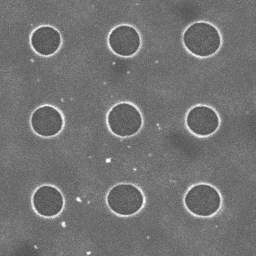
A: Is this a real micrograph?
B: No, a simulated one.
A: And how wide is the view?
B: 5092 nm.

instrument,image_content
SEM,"a regular array of holes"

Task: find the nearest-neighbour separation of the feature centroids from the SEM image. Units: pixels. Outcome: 77.6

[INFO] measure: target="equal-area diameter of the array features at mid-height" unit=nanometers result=618